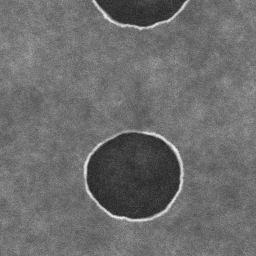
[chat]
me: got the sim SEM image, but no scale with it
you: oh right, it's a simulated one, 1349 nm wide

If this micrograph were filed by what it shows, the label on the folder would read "holes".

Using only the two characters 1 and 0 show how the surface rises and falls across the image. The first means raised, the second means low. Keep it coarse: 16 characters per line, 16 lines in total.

1111110000011111
1111111100111111
1111111111111111
1111111111111111
1111111111111111
1111111111111111
1111111111111111
1111111111111111
1111111001111111
1111110000011111
1111100000011111
1111100000011111
1111110000011111
1111111001111111
1111111111111111
1111111111111111